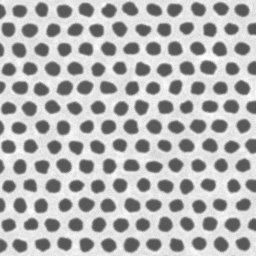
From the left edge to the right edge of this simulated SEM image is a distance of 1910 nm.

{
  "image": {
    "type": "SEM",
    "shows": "a regular array of holes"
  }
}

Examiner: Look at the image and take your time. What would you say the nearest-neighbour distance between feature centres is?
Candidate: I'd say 159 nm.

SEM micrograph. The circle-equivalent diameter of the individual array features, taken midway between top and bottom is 15.2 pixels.